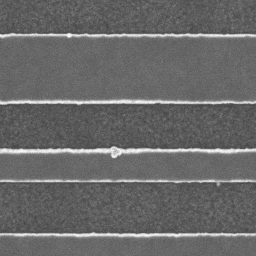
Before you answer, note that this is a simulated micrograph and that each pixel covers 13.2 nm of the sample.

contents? lines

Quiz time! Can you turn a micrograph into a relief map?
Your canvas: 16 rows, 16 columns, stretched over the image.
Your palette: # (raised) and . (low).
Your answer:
................
................
################
################
################
################
................
................
................
################
################
................
................
................
................
################